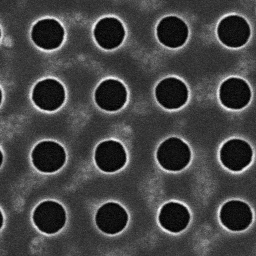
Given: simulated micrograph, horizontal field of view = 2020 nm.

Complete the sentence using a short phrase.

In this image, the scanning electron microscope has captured a regular array of holes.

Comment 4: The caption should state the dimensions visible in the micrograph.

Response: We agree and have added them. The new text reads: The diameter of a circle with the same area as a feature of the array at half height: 258 nm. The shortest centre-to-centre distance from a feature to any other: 481 nanometres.